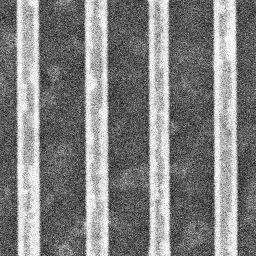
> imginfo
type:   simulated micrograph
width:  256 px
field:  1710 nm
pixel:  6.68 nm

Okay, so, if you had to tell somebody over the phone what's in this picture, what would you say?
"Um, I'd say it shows one or a few lines or trenches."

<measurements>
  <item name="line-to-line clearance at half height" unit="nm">334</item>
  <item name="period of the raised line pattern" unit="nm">439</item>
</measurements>